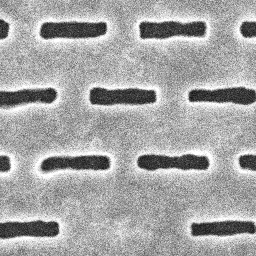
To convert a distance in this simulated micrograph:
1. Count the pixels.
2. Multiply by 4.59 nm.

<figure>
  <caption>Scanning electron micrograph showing holes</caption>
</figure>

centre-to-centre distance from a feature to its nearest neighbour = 380 nm